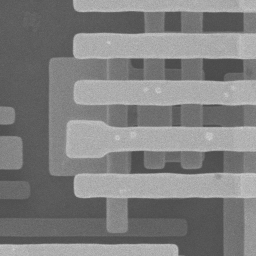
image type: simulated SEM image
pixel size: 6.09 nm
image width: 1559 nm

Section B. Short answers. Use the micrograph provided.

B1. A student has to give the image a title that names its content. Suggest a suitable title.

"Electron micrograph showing wiring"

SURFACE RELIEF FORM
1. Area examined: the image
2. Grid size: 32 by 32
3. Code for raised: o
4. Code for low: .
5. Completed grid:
.........ooooooooooooooooooooooo
..................ooo.oooo....oo
..................oo...oo......o
..................oo...oo......o
.........ooooooooooooooooooooooo
.........ooooooooooooooooooooooo
.........ooooooooooooooooooooooo
.............ooo..ooo.oooo....oo
.............ooo..oo...oo......o
.............ooo..oo...oo......o
.........ooooooooooooooooooooooo
.........ooooooooooooooooooooooo
.........ooooooooooooooooooooooo
.............ooo.ooooo.oo.....oo
.............ooo.oooo..oo......o
........oooooooo.ooooo.oo.....oo
........oooooooooooooooooooooooo
........oooooooooooooooooooooooo
........oooooooooooooooooooooooo
.........ooooooo..ooo..oo......o
.............ooo..ooo..oo......o
.............ooo..............oo
.........ooooooooooooooooooooooo
.........ooooooooooooooooooooooo
..........oooooooooooooooooooooo
.............ooo...............o
.............ooo...............o
.............ooo...............o
.............ooo...............o
...............................o
...............................o
oooooooooooooooooooooo.........o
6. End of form